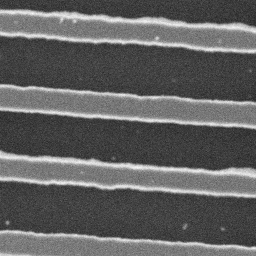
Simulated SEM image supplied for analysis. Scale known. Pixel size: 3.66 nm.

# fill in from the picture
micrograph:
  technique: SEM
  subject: lines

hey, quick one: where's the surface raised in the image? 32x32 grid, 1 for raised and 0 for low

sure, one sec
00000000000000000000000000000000
10000000000000000000000000000000
11111111111111100000000000000000
11111111111111111111111111111110
00011111111111111111111111111111
00000000000000000001111111111111
00000000000000000000000000000000
00000000000000000000000000000000
00000000000000000000000000000000
00000000000000000000000000000000
00000000000000000000000000000000
11111111111000000000000000000000
11111111111111111111111110000000
11111111111111111111111111111111
00000000001111111111111111111111
00000000000000000000000001111111
00000000000000000000000000000000
00000000000000000000000000000000
00000000000000000000000000000000
10000000000000000000000000000000
11111111111110000000000000000000
11111111111111111111111111101100
00011111111111111111111111111111
00000000000000000111111111111111
00000000000000000000000000000000
00000000000000000000000000000000
00000000000000000000000000000000
00000000000000000000000000000000
00000000000000000000000000000000
11111111111000000000000000000000
11111111111111111111111111000000
11111111111111111111111111111111